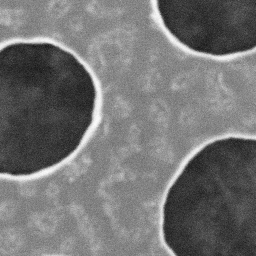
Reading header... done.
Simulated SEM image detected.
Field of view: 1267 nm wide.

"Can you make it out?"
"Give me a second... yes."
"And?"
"holes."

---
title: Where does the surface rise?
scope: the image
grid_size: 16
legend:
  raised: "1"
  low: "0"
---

1111111111000000
1111111111000000
1111111111100000
0000011111111111
0000011111111111
0000001111111111
0000001111111111
0000001111111111
0000011111111111
0000011111110000
0001111111100000
1111111111100000
1111111111000000
1111111111000000
1111111111000000
1111111111100000